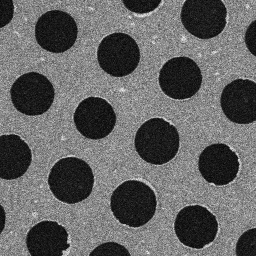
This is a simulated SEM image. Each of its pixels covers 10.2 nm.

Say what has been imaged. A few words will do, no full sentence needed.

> a regular array of holes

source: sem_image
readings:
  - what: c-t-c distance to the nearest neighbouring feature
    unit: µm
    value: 0.676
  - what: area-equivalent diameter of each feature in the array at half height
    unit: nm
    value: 444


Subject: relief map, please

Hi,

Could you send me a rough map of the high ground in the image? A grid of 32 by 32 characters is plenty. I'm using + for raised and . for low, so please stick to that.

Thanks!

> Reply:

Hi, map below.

..+++++++++++++.....+++.....++++
..++++..+++++++++..++++.....++++
.++++....++++++++++++++.....++++
++++......+++++++++++++.....+++.
++++......+++...++++++++...++++.
+++++....+++.....++++++++++++++.
++++++..++++.....++++++++++++++.
++++++++++++.....++++...++++++++
+++++++++++++....+++.....+++++++
+++...++++++++.+++++.....+++++++
++....++++++++++++++.....++++...
+......+++++++++++++.....+++....
+......+++...+++++++++++++++....
++....++++....++++++++++++++....
+++++++++.....++++++++++++++....
+++++++++.....++++...+++++++++++
++++++++++....+++.....++++++++++
...++++++++++++++.....++++++++++
....+++++++++++++.....++++...+++
....+++++++++++++.....+++.....++
....+++....++++++++.+++++.....++
...+++......+++++++++++++.....++
++++++......++++++++++++++...+++
++++++......+++....+++++++++++++
+++++++....+++.....+++++++++++++
++++++++++++++......++++++++++++
.+++++++++++++.....+++....++++++
.++++++++++++++....+++.....+++++
++++....++++++++++++++.....+++++
+++.....++++++++++++++.....+++..
+++......++++..++++++++...++++..
++++....+++.....+++++++++++++...